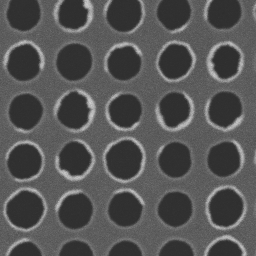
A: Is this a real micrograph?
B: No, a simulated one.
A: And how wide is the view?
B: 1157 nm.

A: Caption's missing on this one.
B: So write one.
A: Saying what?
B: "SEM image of a regular array of holes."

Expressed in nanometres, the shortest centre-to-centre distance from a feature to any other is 218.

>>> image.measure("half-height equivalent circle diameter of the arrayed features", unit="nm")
155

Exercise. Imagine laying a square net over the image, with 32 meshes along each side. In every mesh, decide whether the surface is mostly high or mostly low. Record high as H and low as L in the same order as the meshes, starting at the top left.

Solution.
HLLLLHHHLLHHHHLLLHHHLLLLHHLLLLHH
HLLLLHHLLLLHHLLLLLHHLLLLHHLLLLHH
HLLLLHHLLLLHHLLLLLHHLLLLHHLLLLHH
HHLLHHHHHLHHHHLLLHHHHLHHHHHLLHHH
HHHHHHHHHHHHHHHHHHHHHHHHHHHHHHHH
HHHHHHHHHLHHHHHHHHHHHHHHHHHHHHHH
HLLLLHHLLLLHHHLLLHHHLLLLHHHLLLHH
HLLLLHHLLLLHHLLLLLHHLLLLHHLLLLHH
HLLLLHHLLLLHHLLLLLHHLLLLHHHLLLHH
HHLLHHHHLLLHHHLLLHHHHLLHHHHLLHHH
HHHHHHHHHHHHHHHHHHHHHHHHHHHHHHHH
HHHHHHHHHHHHHHHHHHHHHHHHHHHHLHHH
HHLLLHHHLLLHHHLLLHHHLLLHHHLLLLHH
HLLLLHHLLLLHHHLLLLHHLLLLHHLLLLHH
HLLLLHHLLLLHHHLLLLHHLLLLHHLLLLHH
HHLLLHHHLLLHHHLLLHHHHLHHHHHLLHHH
HHHHHHHHHHHHHHHHHHHHHHHHHHHHHHHH
HHHHHHHHHHHHHHHHHHHHHHHHHHHHHHHH
HHLLHHHHLLLHHHLLLHHHLLLHHHHLLLHH
HLLLLHHLLLLHHLLLLLHHLLLLHHLLLLHH
HLLLLHHLLLLHHLLLLLHHLLLLHHLLLLHH
HLLLLHHHLLLHHHLLLHHHLLLHHHHLLHHH
HHHHHHHHHHHHHHHHHHHHHHHHHHHHHHHH
HHHHHHHHHHHHHHHHHHHHHHHHHHHHHHHH
HHLLLHHHHLLHHHLLLHHHHLLHHHHLLLHH
HLLLLHHHLLLHHHLLLLHHLLLLHHLLLLHH
HLLLLHHLLLLLHHLLLLHHLLLLHHLLLLHH
HLLLLHHHLLLHHHLLLHHHLLLLHHHLLLHH
HHHLHHHHHLHHHHHHHHHHHHHHHHHHHHHH
HHHHHHHHHHHHHHHHHHHHHHHHHHHHHHHH
HHLLHHHHLLLHHHLLLHHHHLLHHHHLLLHH
HLLLLHHHLLLLHHLLLLHHLLLLHHLLLLHH